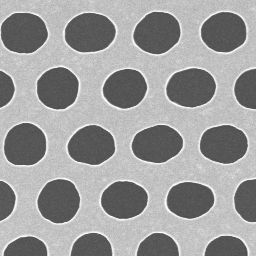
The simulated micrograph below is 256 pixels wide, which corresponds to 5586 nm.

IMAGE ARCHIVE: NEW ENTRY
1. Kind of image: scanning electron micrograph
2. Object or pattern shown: a regular array of holes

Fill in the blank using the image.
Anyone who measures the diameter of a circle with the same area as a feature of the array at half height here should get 0.948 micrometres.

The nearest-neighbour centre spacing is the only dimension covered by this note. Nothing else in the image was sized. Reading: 64.2 pixels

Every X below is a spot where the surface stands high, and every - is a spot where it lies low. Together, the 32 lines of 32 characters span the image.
XXXXXXXXXXXXXXXXXXXXXXXXXXXXXXXX
XXXXXXXXXXXXXXXXXXX-XXXXXXXX-XXX
X----XXXX-----XXXX----XXXX----XX
------XX------XXX-----XXX------X
------XX------XXX-----XXX------X
-----XXX------XXX-----XXXX----XX
XX--XXXXXX--XXXXXX---XXXXXXX-XXX
XXXXXXXXXXXXXXXXXXXXXXXXXXXXXXXX
XXXXXXX-XXXXXXXXXXXXXXXXXXXXXXXX
-XXXX----XXXXX----XXX-----XXXX--
--XXX-----XXX-----XXX------XX---
--XXX-----XXX-----XXX------XX---
-XXXX----XXXX-----XXX-----XXXX--
XXXXXX--XXXXXXX-XXXXXXXXXXXXXXX-
XXXXXXXXXXXXXXXXXXXXXXXXXXXXXXXX
XX--XXXXXXXXXXXXXXXXXXXXXXXXXXXX
X----XXXXX----XXX-----XXXX----XX
X-----XXX-----XXX------XX------X
------XX------XX-------XX------X
X----XXXX-----XXX-----XXX-----XX
XX--XXXXXXX-XXXXXXXXXXXXXXXXXXXX
XXXXXXXXXXXXXXXXXXXXXXXXXXXXXXXX
XXXXXXX-XXXXXXXXXXXXXXXXXXXXXXX-
-XXXX-----XXX-----XXX-----XXXX--
--XXX-----XXX-----XXX------XX---
--XXX-----XXX-----XXX------XX---
-XXXX-----XXX-----XXX-----XXXX--
XXXXXX---XXXXXXXXXXXXXXXXXXXXXX-
XXXXXXXXXXXXXXXXXXXXXXXXXXXXXXXX
XXXXXXXXXX---XXXXXX--XXXXXXX-XXX
X-----XXX-----XXXX----XXXX-----X
X-----XXX-----XXX-----XXXX-----X